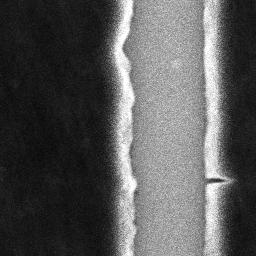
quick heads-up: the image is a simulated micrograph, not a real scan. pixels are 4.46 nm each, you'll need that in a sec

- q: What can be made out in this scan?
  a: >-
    one or a few lines or trenches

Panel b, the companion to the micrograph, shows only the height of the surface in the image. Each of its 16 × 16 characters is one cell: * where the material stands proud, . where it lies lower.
********.....***
********.....***
********.....***
********.....***
********.....***
********.....***
********.....***
********.....***
********.....***
********.....***
********.....***
********.....***
********.....***
********.....***
********.....***
********.....***